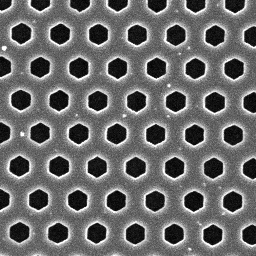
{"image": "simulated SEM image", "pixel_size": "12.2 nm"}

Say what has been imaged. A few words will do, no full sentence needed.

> a regular array of holes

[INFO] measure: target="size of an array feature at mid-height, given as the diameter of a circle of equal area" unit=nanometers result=248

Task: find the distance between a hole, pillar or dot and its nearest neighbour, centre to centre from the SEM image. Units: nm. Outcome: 467